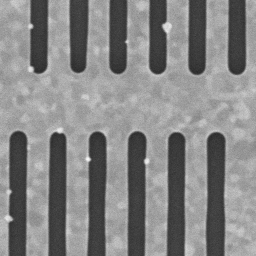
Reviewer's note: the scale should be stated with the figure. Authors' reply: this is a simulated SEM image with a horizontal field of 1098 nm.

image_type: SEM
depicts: groups of lines, slits or small figures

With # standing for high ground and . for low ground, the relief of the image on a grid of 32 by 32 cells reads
####..###..###..###..###..##...#
####..###..###..###..###..##...#
####..###..###..###..###..##...#
####..###..###..###.####..##...#
####..###..###..###..###..##...#
####..###..###..###..###..##...#
####..###..###..###..###..##...#
####..###..###..###..###..##...#
####..###..###..###..###..##...#
################################
################################
################################
################################
################################
################################
################################
##.##############.##############
#..###..###..###..###..###..####
#...##..###..###..###..###..####
#...##..###..###..###..###..####
#...##..###..###..###..###..####
#..###..###..###..###..###..####
#..###..###..###..###..###..####
#..###..###..###..###..###..####
#..###..###..###..###..###..####
#..###..###..###..###..###..####
#..###..###..###..###..###..####
#..###..###..###..###..###..####
#..###..###..###..###..###..####
#..###..###..###..###..###..####
#..###..###..###..###..###..####
#..###..###..###..###..###..####